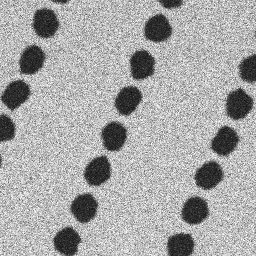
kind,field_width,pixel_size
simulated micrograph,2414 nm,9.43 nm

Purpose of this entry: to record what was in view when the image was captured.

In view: a regular array of holes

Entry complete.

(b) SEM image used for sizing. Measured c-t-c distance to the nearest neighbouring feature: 362 nanometres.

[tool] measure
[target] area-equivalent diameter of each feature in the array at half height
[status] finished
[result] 0.263 microns